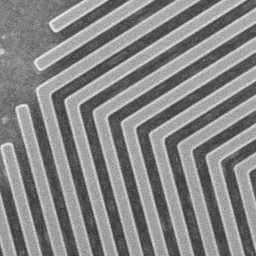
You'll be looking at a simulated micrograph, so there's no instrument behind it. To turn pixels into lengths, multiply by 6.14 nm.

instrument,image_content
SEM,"groups of lines, slits or small figures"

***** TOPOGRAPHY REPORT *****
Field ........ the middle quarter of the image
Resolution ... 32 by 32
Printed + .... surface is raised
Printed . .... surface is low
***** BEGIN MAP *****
..++++++.....++++++......++++++.
++++++......+++++......++++++...
++++......++++++......++++++....
+++......++++++.....++++++......
+......++++++......+++++......++
......+++++......++++++......+++
....+++++......++++++......+++++
..++++++......+++++......++++++.
.+++++......++++++......+++++...
+++++......+++++......++++++....
++++.....++++++......+++++......
.+++....+++++......++++++......+
.+++...++++......++++++......+++
.+++....+++.....+++++......+++++
..+++...+++....+++++......+++++.
..+++...+++....+++......++++++..
..+++...+++....+++....++++++....
..+++....+++...+++....+++++.....
..++++...+++...+++....+++......+
...+++...+++...++++...+++....+++
...+++...++++...+++...+++...++++
...++++...+++...+++...++++...+++
...++++...+++...+++...++++...+++
+...+++...+++...++++...+++...+++
+...+++...++++...+++...+++...+++
+...++++...+++...+++...++++...++
++...+++...+++...++++...+++...++
++...+++...++++...+++...+++...++
++...+++...++++...+++...+++...++
++...++++...+++...+++...++++...+
++....+++...+++...+++....+++...+
+++...+++...+++....+++...+++...+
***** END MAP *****